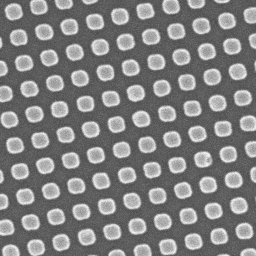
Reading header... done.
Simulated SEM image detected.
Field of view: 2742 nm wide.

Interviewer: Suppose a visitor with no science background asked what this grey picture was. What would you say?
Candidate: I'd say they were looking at a regular array of raised bodies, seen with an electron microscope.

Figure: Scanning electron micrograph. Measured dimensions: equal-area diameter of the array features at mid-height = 170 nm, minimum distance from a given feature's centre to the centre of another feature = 276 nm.